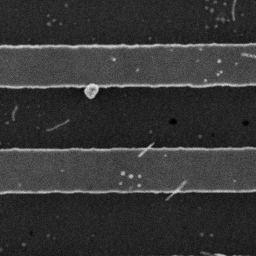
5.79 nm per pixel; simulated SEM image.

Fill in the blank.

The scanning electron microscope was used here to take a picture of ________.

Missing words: lines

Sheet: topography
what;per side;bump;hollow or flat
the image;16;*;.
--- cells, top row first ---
................
................
................
****************
****************
.....*..........
................
................
................
****************
****************
****************
................
................
................
................